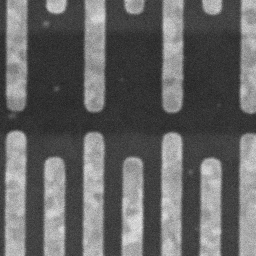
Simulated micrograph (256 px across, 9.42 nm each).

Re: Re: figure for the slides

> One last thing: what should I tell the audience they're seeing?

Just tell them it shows wiring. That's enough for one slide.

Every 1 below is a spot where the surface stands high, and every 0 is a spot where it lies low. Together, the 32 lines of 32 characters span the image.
01100011000110001100111000110011
01100000000110001000011000100011
01100000000110000000011000000011
01100000000110000000011000000011
01100000000110000000111000000011
01100000000110000000111000000011
01100000000110000000111000000011
01100000000110000000111000000011
01100000000110000000111000000011
01100000000110000000111000000011
01100000000110000000111000000011
01100000000110000000111000000011
01100000000110000000111000000011
01100000000110000000010000000011
00000000000000000000000000000000
00000000000000000000000000000000
00000000000000000000000000000000
01100000000110000000111000000011
01100000000110000000111000000011
01100000000110000000111000000011
01100011000110001100111001100011
01100011000110011100111001100011
01100011000110011100111001100011
01100011000110011100111001100011
01100011000110011100111001100011
01100011000110011100111001100011
01100011000110011100111001100011
01100011000110011100111001100011
01100011000110011100110001100011
01100011000110011100110001100011
01100011000110011100110001100011
01100011000110011100110001100011